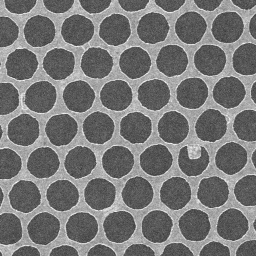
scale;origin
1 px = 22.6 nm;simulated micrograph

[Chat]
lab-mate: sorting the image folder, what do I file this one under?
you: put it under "a regular array of holes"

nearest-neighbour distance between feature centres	840	nm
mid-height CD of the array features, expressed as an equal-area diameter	739	nanometers